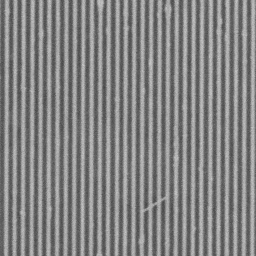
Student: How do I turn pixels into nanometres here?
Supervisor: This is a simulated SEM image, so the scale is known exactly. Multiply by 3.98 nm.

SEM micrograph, parallel lines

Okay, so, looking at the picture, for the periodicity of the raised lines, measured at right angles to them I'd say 33.7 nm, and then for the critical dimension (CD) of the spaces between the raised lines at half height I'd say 18.4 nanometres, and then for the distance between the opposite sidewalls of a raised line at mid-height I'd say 14.4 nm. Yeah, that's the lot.